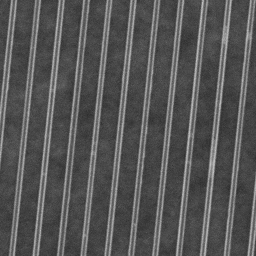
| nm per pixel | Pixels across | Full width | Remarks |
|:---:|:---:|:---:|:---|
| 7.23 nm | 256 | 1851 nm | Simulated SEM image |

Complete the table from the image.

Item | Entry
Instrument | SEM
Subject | parallel lines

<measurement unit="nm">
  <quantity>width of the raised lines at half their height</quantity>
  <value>33.2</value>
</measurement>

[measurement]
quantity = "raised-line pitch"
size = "23.7 pixels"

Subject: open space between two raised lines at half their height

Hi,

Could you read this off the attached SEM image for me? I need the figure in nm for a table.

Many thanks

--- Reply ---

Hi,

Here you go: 138